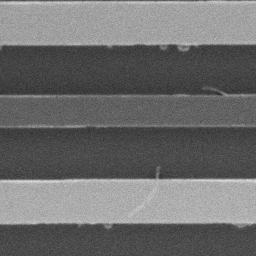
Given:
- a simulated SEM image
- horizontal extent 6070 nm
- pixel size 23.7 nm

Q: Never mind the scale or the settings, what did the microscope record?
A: lines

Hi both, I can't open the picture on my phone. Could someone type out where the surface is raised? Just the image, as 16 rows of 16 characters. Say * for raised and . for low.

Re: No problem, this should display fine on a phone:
****************
****************
****************
................
................
................
****************
****************
................
................
................
****************
****************
****************
................
................